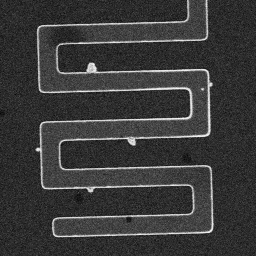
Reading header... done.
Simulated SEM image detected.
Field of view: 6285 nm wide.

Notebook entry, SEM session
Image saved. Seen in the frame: groups of lines, slits or small figures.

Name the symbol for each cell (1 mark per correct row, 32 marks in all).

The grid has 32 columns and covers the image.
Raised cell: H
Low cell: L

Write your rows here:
LLLLLLLLLLLLLLLLLLLLLLLLHHLLLLLL
LLLLLLLLLLLLLLLLLLLLLLLLHHLLLLLL
LLLLLLLLLLLLLLLLLLLLLLLHHHLLLLLL
LLLLLHHHHHHHHHHHHHHHHHHHHHLLLLLL
LLLLLHHHHHHHHHHHHHHHHHHHHHLLLLLL
LLLLLHHHLLLLLLLLLLLLLLLLLLLLLLLL
LLLLLHHLLLLLLLLLLLLLLLLLLLLLLLLL
LLLLLHHLLLLLLLLLLLLLLLLLLLLLLLLL
LLLLLHHLLLLHLLLLLLLLLLLLLLLLLLLL
LLLLLHHHHHHHHHHHHHHHHHHHHHLLLLLL
LLLLLHHHHHHHHHHHHHHHHHHHHHLLLLLL
LLLLLHHHHLLLLLLLLLLLLLLLHHLLLLLL
LLLLLLLLLLLLLLLLLLLLLLLLHHLLLLLL
LLLLLLLLLLLLLLLLLLLLLLLLHHLLLLLL
LLLLLLLLLLLLLLLLLLLLLLLLHHLLLLLL
LLLLLHHHHHHHHHHHHHHHHHHHHHLLLLLL
LLLLLHHHHHHHHHHHHHHHHHHHHHLLLLLL
LLLLLHHHHLLLLLLLHLLLLLLLLLLLLLLL
LLLLLHHLLLLLLLLLLLLLLLLLLLLLLLLL
LLLLLHHLLLLLLLLLLLLLLLLLLLLLLLLL
LLLLLHHHLLLLLLLLLLLLLLLLLLLLLLLL
LLLLLHHHHHHHHHHHHHHHHHHHHHLLLLLL
LLLLLHHHHHHHHHHHHHHHHHHHHHLLLLLL
LLLLLLHHHLHHLLLLLLLLLLLLHHLLLLLL
LLLLLLLLLLLLLLLLLLLLLLLLHHLLLLLL
LLLLLLLLLLLLLLLLLLLLLLLLHHLLLLLL
LLLLLLLLLLLLLLLLLLLLLLLLHHHLLLLL
LLLLLLLHHHHHHHHHHHHHHHHHHHHLLLLL
LLLLLLLHHHHHHHHHHHHHHHHHHHHLLLLL
LLLLLLLHLLLLLLLLLLLLLLLLLLLLLLLL
LLLLLLLLLLLLLLLLLLLLLLLLLLLLLLLL
LLLLLLLLLLLLLLLLLLLLLLLLLLLLLLLL